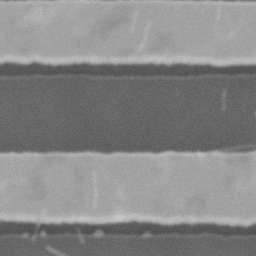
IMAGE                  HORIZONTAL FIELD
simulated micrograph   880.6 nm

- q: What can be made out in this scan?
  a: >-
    lines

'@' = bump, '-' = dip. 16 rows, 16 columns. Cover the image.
@@@@@@@@@@@@@@@@
@@@@@@@@@@@@@@@@
@@@@@@@@@@@@@@@@
@@@@@@@@@@@@@@@@
----------------
----------------
----------------
----------------
----------------
-----@----@-@@-@
@@@@@@@@@@@@@@@@
@@@@@@@@@@@@@@@@
@@@@@@@@@@@@@@@@
@@@@@@@@@@@@@@@@
----------------
----------------